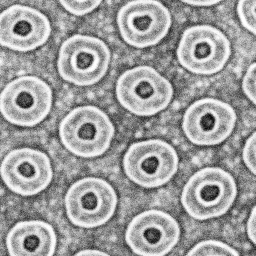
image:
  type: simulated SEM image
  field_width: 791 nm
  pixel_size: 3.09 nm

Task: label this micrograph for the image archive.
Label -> a regular array of ring-shaped raised bodies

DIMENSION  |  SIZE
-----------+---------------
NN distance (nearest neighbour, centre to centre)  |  217 nm